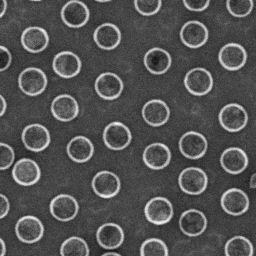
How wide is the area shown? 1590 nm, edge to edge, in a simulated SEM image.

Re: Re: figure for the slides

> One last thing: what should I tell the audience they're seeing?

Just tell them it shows a regular array of raised bodies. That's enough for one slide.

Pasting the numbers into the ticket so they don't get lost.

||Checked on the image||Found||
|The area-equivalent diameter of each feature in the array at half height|157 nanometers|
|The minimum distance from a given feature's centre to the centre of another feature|0.254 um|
